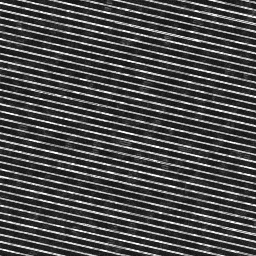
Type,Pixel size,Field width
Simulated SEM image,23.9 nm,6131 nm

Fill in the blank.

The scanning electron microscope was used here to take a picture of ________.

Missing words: parallel lines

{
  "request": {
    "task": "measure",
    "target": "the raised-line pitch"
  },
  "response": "169 nm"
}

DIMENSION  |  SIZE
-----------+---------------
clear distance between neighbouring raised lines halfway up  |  5.49 pixels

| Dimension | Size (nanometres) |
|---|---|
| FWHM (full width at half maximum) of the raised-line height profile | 35.1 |